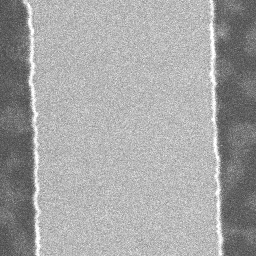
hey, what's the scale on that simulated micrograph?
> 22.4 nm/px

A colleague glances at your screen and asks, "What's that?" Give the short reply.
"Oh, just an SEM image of one or a few lines or trenches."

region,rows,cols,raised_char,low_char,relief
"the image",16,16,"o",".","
oo...........ooo
oo...........ooo
oo...........ooo
oo...........ooo
oo...........ooo
oo...........ooo
oo...........ooo
oo...........ooo
oo...........ooo
oo...........ooo
oo............oo
oo............oo
oo............oo
oo............oo
oo............oo
oo............oo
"